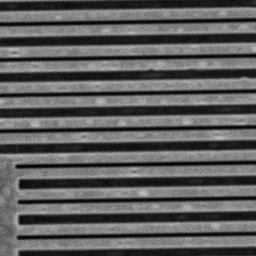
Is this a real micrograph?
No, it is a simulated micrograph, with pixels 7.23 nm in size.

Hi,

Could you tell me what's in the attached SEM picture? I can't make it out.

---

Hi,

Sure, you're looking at parallel lines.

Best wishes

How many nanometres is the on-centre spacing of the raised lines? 127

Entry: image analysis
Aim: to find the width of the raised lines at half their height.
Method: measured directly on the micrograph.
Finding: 80.4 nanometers